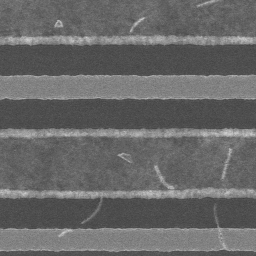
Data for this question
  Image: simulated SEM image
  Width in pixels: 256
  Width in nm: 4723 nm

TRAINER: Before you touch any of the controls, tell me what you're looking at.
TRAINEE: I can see lines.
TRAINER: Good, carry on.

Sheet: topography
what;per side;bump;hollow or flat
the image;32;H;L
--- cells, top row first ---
HHHHHHHHHHHHHHHHHHHHHHHHHHHHHHHH
HHHHHHHHHHHHHHHHHHHHHHHHHHHHHHHH
HHHHHHHHHHHHHHHHHHHHHHHHHHHHHHHH
HHHHHHHHHHHHHHHHHHHHHHHHHHHHHHHH
HHHHHHHHHHHHHHHHHHHHHHHHHHHHHHHH
LLLLLLLLLLLLLLLLLLLLLLLLLLLLLLLL
LLLLLLLLLLLLLLLLLLLLLLLLLLLLLLLL
LLLLLLLLLLLLLLLLLLLLLLLLLLLLLLLL
LLLLLLLLLLLLLLLLLLLLLLLLLLLLLLLL
LHHHLHLHHHHHHHHHHHLHHHHHHHHHHHHH
HHHHHHHHHHHHHHHHHHHHHHHHHHHHHHHH
HHHHHHHHHHHHHHHHHHHHHHHHHHHHHHHH
LLLLLLLLLLLLLLLLLLLLLLLLLLLLLLLL
LLLLLLLLLLLLLLLLLLLLLLLLLLLLLLLL
LLLLLLLLLLLLLLLLLLLLLLLLLLLLLLLL
LLLLLLLLLLLLLLLLLLLLLLLLLLLLLLLL
HHHHHHHHHHHHHHHHHHHHHHHHHHHHHHHH
HHHHHHHHHHHHHHHHHHHHHHHHHHHHHHHH
HHHHHHHHHHHHHHHHHHHHHHHHHHHHHHHH
HHHHHHHHHHHHHHHHHHHHHHHHHHHHHHHH
HHHHHHHHHHHHHHHHHHHHHHHHHHHHHHHH
HHHHHHHHHHHHHHHHHHHHHHHHHHHHHHHH
HHHHHHHHHHHHHHHHHHHHHHHHHHHHHHHH
HHHHHHHHHHHHHHHHHHHHHHHHHHHHHHHH
LHHHHHLHHHHHHHHHHHHHHHHHLLLLLLLH
LLLLLLLLLLLLLLLLLLLLLLLLLLLLLLLL
LLLLLLLLLLLLLLLLLLLLLLLLLLLLLLLL
LLLLLLLLLLLLLLLLLLLLLLLLLLLLLLLL
LLLLLLLLLLLLLHLLLLLLLLLLLLLHLLLL
HHHHHHHHHHHHHHHHHHHHHHHHHHHHHHHH
HHHHHHHHHHHHHHHHHHHHHHHHHHHHHHHH
LLLLLLLLLLLLLLLLLLLLLLLLLLLLLLLL